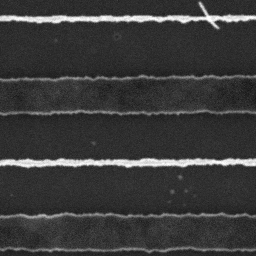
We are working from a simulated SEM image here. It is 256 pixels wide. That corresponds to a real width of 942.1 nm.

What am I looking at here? lines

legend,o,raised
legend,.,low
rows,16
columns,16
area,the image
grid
................
................
................
................
................
oooooooooooooooo
oooooooooooooooo
................
................
................
................
................
................
oooooooooooooooo
oooooooooooooooo
oooooooooooooooo